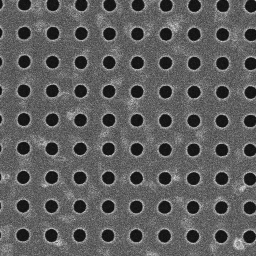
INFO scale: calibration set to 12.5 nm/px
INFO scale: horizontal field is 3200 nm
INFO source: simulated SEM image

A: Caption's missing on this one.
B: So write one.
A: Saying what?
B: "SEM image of a regular array of holes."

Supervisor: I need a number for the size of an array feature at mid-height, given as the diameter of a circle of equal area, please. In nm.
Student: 162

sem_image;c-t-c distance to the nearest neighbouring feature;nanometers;352